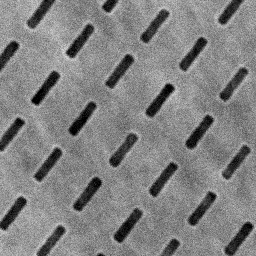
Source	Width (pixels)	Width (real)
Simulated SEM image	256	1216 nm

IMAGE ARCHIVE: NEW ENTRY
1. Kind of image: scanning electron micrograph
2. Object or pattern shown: a regular array of holes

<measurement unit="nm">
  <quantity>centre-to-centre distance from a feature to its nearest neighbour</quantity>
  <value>232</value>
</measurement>